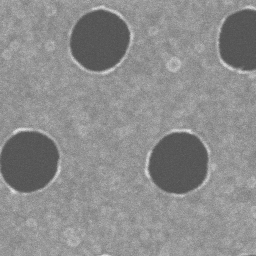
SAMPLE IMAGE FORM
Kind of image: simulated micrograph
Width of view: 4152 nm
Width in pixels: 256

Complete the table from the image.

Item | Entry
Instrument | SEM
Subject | holes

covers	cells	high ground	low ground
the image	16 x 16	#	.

################
#####...######..
####....######..
#####...######..
################
################
################
################
#..#######..####
....#####....###
....#####....###
...#######...###
################
################
################
################